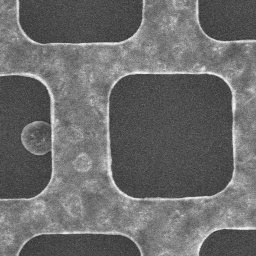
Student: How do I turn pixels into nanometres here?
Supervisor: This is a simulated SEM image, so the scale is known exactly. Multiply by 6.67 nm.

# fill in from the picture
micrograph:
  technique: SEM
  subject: holes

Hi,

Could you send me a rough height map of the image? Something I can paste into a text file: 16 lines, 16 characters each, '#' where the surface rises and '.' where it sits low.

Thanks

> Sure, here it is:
#........###....
#........####...
##......######..
################
################
...####.......##
...####........#
...####........#
...####........#
...####........#
...####........#
...####.......##
################
################
#############...
#........####...